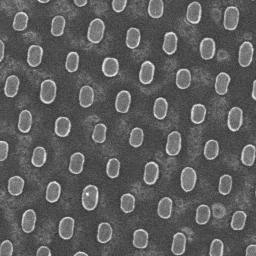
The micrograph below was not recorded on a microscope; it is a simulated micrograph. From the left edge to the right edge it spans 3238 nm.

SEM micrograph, a regular array of raised bodies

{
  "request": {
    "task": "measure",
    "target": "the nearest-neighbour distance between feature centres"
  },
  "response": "470 nm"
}